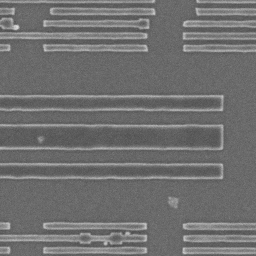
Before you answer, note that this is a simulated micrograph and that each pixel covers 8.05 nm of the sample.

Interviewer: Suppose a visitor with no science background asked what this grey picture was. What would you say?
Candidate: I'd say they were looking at wiring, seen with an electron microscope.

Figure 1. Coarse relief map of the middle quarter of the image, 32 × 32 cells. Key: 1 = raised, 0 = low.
00000000000000000000000000000000
00000000000000000000000000000000
00000000000000000000000000000000
00000000000000000000000000000000
00000000000000000000000000000000
00000000000000000000000000000000
00000000000000000000000000000000
00000000000000000000000000000000
11111111111111111111111111111111
11111111111111111111111111111111
11111111111111111111111111111111
11111111100000001000111101111111
00000000000000000000000000000000
00000000000000000000000000000000
00000000000000000000000000000000
11111111111111111111111111111111
11111111111111111111111111111111
11111111111111111111111111111111
11111111111111111111111111111111
11111111111111111111111111111111
11111111111111111111111111111111
00000000000000000000000000000000
00000000000000000000000000000000
00000000000000000000000000000000
00000000000000000000000000000000
11111111111111111111111111111111
11111111111111111111111111111111
11111111111111111111111111111111
10001111111011111111110011111111
00000000000000000000000000000000
00000000000000000000000000000000
00000000000000000000000000000000